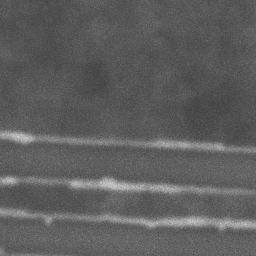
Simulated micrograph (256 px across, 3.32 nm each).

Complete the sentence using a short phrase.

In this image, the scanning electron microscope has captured one or a few lines or trenches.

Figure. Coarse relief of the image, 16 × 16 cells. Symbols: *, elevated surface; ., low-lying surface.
****************
****************
****************
****************
****************
****************
****************
****************
****************
................
................
*********.......
****************
.***************
................
................